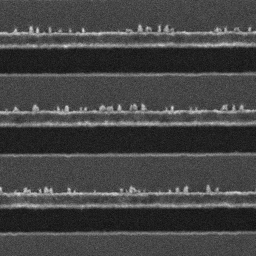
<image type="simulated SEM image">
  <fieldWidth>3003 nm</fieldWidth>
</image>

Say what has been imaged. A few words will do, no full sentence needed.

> lines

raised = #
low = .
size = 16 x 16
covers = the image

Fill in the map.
################
################
################
................
................
################
################
################
................
................
################
################
################
................
................
################